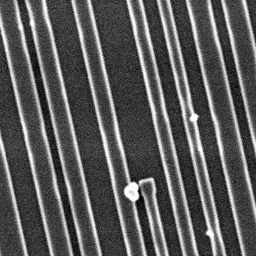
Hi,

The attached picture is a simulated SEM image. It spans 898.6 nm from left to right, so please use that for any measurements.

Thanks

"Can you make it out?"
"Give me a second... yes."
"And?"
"groups of lines, slits or small figures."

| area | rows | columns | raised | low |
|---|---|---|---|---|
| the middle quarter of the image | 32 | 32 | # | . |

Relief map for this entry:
......####..........###....###..
......####..........###....###..
......####..........###.....##..
......#####.........####....##..
......#####..........###....###.
.......####..........###....###.
.......####..........###....###.
.......#####.........####....##.
.......#####.........####....##.
#.......####..........###....###
#.......####..........###.....##
#.......#####.........###.....##
#.......#####.........####....##
##.......####.........####....##
##.......####..........###....##
##.......####..........###....##
##.......####..........###....##
###......####..........####....#
###.......####.........####....#
###.......####..........###....#
###.......####..........###.....
####......#####.........####....
####.......####.........####....
####.......####..........###....
####.......####..........###....
####.......#####.........####...
####........####.........####...
#####.......####..........###...
#####.......####..........###...
#####.......#####..###....####..
.####.......######.####...####..
.#####.......#####.####...####..